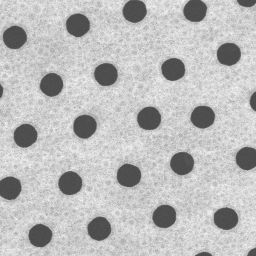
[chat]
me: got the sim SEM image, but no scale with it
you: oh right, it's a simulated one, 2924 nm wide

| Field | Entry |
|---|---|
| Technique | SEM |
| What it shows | a regular array of holes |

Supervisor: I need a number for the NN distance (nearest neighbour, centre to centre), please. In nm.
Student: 620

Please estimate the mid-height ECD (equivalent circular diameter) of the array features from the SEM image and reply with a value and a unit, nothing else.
0.272 um